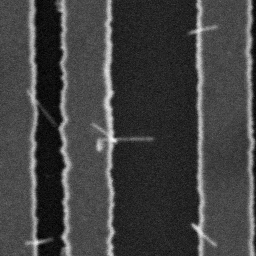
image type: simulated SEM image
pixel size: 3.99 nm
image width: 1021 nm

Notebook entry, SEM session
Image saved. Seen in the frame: lines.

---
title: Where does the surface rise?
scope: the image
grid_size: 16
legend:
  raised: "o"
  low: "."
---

oo..ooo.....oooo
oo..ooo.....oooo
oo..ooo.....oooo
oo..ooo.....oooo
oo..ooo.....oooo
oo..ooo.....oooo
oo..ooo.....oooo
oo..ooo.....oooo
oo..ooo.....oooo
oo..ooo.....oooo
oo..ooo.....oooo
oo..ooo.....oooo
oo..ooo.....oooo
oo..ooo.....oooo
oo..ooo.....oooo
oo..ooo.....oooo